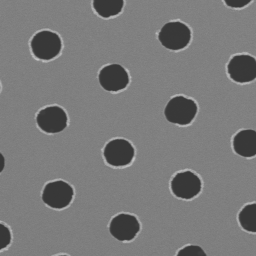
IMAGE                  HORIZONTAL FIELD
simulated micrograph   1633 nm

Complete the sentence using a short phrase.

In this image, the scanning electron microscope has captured a regular array of holes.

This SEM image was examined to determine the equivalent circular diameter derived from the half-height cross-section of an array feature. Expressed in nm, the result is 183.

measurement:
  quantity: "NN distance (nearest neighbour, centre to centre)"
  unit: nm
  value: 474